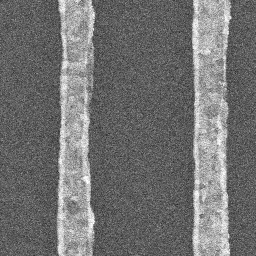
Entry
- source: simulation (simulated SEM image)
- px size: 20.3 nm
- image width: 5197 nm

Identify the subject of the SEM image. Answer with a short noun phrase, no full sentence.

one or a few lines or trenches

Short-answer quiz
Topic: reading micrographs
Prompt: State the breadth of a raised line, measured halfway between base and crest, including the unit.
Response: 530 nm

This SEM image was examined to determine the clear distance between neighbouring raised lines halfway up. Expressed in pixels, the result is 110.